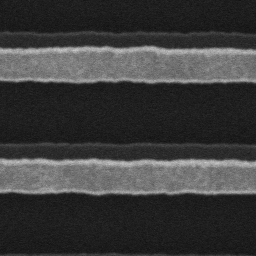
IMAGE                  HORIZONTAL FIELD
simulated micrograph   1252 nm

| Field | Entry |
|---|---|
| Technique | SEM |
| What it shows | lines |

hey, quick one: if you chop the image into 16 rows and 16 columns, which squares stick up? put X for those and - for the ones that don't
----------------
----------------
XXXXXXXXXXXXXXXX
XXXXXXXXXXXXXXXX
XXXXXXXXXXXXXXXX
----------------
----------------
----------------
----------------
XXXXXXXXXXXXXXXX
XXXXXXXXXXXXXXXX
XXXXXXXXXXXXXXXX
----------------
----------------
----------------
----------------